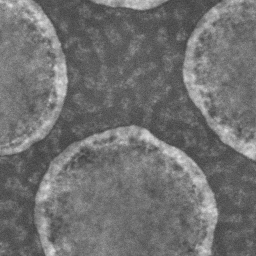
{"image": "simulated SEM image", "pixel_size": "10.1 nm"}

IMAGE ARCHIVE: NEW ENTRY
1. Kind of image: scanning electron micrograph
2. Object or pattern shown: raised bodies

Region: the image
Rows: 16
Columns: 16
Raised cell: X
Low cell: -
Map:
XX------------XX
XXX----------XXX
XXX---------XXXX
XXXX--------XXXX
XXXX--------XXXX
XXXX--------XXXX
XXXX--------XXXX
XXX----------XXX
XX----XXX-----XX
----XXXXXXX-----
---XXXXXXXXX----
---XXXXXXXXXX---
---XXXXXXXXXX---
---XXXXXXXXXX---
---XXXXXXXXXX---
---XXXXXXXXXX---